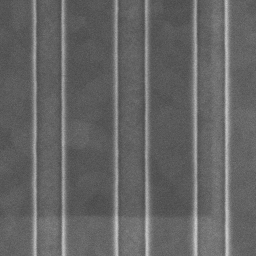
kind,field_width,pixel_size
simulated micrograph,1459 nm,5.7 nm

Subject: wiring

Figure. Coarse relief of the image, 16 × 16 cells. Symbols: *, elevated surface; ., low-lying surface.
**..***..***..**
**..***..***..**
**..***..***..**
**..***..***..**
**..***..***..**
**..***..***..**
**..***..***..**
**..***..***..**
**..***..***..**
**..***..***..**
**..***..***..**
**..***..***..**
**..***..***..**
**..***..***..**
**..***..***..**
**..***..***..**